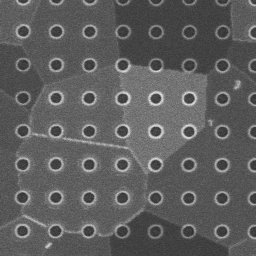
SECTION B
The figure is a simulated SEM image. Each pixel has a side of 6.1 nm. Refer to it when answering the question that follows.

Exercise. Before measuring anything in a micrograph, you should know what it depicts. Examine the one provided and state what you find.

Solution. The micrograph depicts a regular array of holes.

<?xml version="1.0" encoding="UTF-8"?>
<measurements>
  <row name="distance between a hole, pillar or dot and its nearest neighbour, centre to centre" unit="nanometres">200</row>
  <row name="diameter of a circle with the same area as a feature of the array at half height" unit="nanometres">75.7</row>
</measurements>